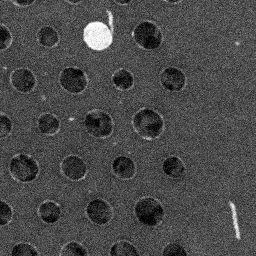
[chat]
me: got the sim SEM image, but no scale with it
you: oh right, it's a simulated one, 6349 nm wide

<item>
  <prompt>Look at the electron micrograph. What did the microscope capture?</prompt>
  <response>a regular array of raised bodies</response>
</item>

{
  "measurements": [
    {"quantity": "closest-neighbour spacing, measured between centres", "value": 1.24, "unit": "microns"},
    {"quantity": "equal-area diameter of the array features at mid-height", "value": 636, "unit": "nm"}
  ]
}